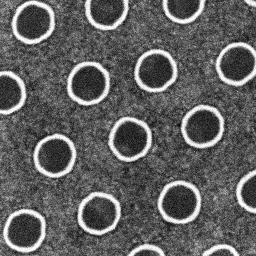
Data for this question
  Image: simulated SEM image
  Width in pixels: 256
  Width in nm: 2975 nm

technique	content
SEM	a regular array of raised bodies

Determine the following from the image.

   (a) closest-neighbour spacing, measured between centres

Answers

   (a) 844 nanometres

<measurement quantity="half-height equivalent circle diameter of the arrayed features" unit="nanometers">457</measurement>